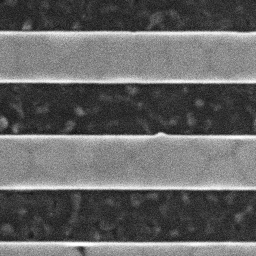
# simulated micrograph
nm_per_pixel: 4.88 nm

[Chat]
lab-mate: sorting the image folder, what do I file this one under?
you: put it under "one or a few lines or trenches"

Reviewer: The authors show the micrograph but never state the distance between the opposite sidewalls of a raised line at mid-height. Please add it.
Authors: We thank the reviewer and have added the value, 243 nanometres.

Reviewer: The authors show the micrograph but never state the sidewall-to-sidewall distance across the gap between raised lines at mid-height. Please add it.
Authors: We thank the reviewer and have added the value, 260 nanometers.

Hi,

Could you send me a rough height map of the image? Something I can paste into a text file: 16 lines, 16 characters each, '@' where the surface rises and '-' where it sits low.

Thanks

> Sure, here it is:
----------------
----------------
@@@@@@@@@@@@@@@@
@@@@@@@@@@@@@@@@
@@@@@@@@@@@@@@@@
----------------
----------------
----------------
@@-------@@-----
@@@@@@@@@@@@@@-@
@@@@@@@@@@@@@@@@
@@@@@@@@@@@@@@@@
----------------
----------------
----------------
@@@@--@@@@@@@@@@